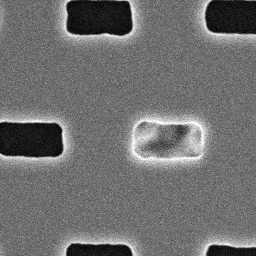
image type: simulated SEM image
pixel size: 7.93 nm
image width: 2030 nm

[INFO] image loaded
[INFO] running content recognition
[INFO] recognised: holes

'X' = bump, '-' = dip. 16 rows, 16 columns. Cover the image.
XXXX----XXXXX---
XXXX----XXXXX---
XXXXXXXXXXXXXXXX
XXXXXXXXXXXXXXXX
XXXXXXXXXXXXXXXX
XXXXXXXXXXXXXXXX
XXXXXXXXXXXXXXXX
XXXXXXXXXXXXXXXX
----XXXXXXXXXXXX
----XXXXXXXXXXXX
XXXXXXXXXXXXXXXX
XXXXXXXXXXXXXXXX
XXXXXXXXXXXXXXXX
XXXXXXXXXXXXXXXX
XXXXXXXXXXXXXXXX
XXXX----XXXXX---